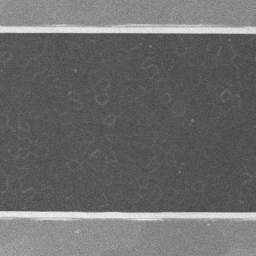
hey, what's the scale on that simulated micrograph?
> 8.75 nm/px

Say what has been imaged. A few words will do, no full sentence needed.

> one or a few lines or trenches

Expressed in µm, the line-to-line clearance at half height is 1.61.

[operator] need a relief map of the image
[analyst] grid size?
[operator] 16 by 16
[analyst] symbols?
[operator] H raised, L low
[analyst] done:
HHHHHHHHHHHHHHHH
HHHHHHHHHHHHHHHH
LLLLLLLLLLLLLLLL
LLLLLLLLLLLLLLLL
LLLLLLLLLLLLLLLL
LLLLLLLLLLLLLLLL
LLLLLLLLLLLLLLLL
LLLLLLLLLLLLLLLL
LLLLLLLLLLLLLLLL
LLLLLLLLLLLLLLLL
LLLLLLLLLLLLLLLL
LLLLLLLLLLLLLLLL
LLLLLLLLLLLLLLLL
HHHHHHHHHLHHHHHH
HHHHHHHHHHHHHHHH
HHHHHHHHHHHHHHHH